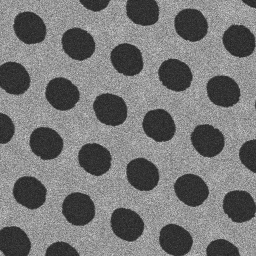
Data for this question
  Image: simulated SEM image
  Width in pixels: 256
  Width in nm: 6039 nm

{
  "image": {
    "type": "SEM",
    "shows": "a regular array of holes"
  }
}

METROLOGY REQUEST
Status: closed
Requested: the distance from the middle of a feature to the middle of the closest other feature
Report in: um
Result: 1.2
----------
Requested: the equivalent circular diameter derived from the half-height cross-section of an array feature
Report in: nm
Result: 781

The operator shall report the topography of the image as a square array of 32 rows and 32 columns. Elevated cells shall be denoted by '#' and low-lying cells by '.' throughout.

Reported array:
##########....##....###########.
###.############....##...#######
##...###########....##....######
##....###.############....###..#
##....##...###########....##....
########....###.############....
########....##....###########...
##############....###.##########
...###########....##....########
....################....###.####
....##...###########....##....##
#..###....################....##
######....##...###########....##
#######..###....################
.###########....##...###########
..###########..###....##########
..##...###########....##....####
.###....###########..###....####
####....##...###########....##..
#####..###....###########..###..
##########....##...###########..
###########..###....############
##...###########....##...#######
##....###########..###....######
##....##...###########....##...#
###..###....###########..###....
########....##...###########....
########...###....###########..#
..############....##...#########
...############...##....########
....###..###########....##...###
....##....###########...##....##